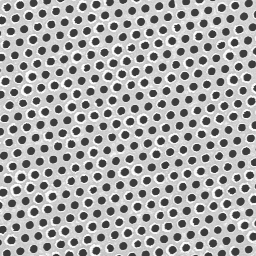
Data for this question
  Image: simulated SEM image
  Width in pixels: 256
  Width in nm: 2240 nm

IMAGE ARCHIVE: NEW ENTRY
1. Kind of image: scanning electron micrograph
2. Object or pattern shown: a regular array of holes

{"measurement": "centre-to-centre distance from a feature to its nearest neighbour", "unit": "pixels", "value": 13.5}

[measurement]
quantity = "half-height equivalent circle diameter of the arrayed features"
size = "0.0698 micrometres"